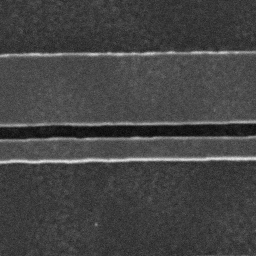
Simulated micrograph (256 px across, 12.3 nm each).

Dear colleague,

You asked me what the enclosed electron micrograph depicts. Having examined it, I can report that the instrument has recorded lines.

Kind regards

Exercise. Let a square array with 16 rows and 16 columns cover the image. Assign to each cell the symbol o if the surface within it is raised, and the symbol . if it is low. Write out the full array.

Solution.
................
................
................
oooooooooooooooo
oooooooooooooooo
oooooooooooooooo
oooooooooooooooo
oooooooooooooooo
oooooooooooooooo
oooooooooooooooo
................
................
................
................
................
................